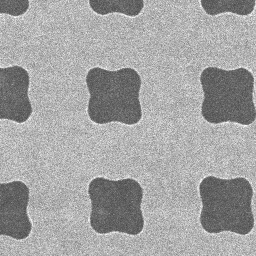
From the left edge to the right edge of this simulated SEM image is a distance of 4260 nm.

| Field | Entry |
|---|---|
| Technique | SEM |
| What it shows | holes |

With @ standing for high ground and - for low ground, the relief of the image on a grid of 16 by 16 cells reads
--@@@@---@@@@---
@@@@@@@@@@@@@@@@
@@@@@@@@@@@@@@@@
@@@@@@@@@@@@@@@@
--@@@@--@@@@@---
--@@@----@@@@---
--@@@@---@@@@---
@-@@@@---@@@@---
@@@@@@@@@@@@@@@@
@@@@@@@@@@@@@@@@
@@@@@@@@@@@@@@@@
-@@@@@---@@@@---
--@@@@---@@@@---
--@@@@---@@@@---
--@@@@---@@@@--@
@@@@@@@@@@@@@@@@